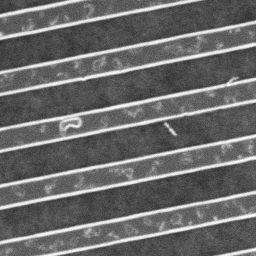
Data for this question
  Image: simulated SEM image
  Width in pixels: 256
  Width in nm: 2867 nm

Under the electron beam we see parallel lines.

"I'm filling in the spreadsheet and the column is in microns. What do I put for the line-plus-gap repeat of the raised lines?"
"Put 0.623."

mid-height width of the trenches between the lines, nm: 372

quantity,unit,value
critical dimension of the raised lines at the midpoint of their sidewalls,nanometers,246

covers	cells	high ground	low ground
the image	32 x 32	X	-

-------XXXXXXXXXXXXXXX----------
--XXXXXXXXXXXXXXX---------------
XXXXXXXXXXX---------------------
XXXXXXX---------------------XXXX
XX---------------------XXXXXXXXX
------------------XXXXXXXXXXXXXX
-------------XXXXXXXXXXXXXX-----
--------XXXXXXXXXXXXXX----------
---XXXXXXXXXXXXXXX--------------
XXXXXXXXXXXX--------------------
XXXXXXX---------------------XXXX
XX----------------------XXXXXXXX
-------------------XXXXXXXXXXXXX
--------------XXXXXXXXXXXXX-----
---------XXXXXXXXXXXXXX---------
---XXXXXXXXXXXXXXX--------------
XXXXXXXXXXXXX-------------------
XXXXXXX-----------------------XX
XX----------------------XXXXXXXX
-------------------XXXXXXXXXXXXX
--------------XXXXXXXXXXXXXX----
---------XXXXXXXXXXXXXX---------
----XXXXXXXXXXXXXX--------------
XXXXXXXXXXXXX-------------------
XXXXXXXX----------------------XX
XX----------------------XXXXXXXX
-------------------XXXXXXXXXXXXX
--------------XXXXXXXXXXXXXXX---
---------XXXXXXXXXXXXXXX--------
----XXXXXXXXXXXXXXX-------------
XXXXXXXXXXXXXX------------------
XXXXXXXX----------------------XX